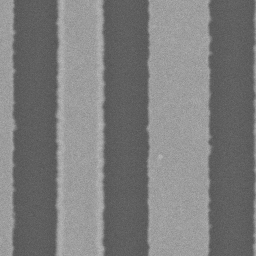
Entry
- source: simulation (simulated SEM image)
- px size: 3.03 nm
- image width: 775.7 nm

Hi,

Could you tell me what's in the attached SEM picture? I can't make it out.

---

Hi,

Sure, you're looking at lines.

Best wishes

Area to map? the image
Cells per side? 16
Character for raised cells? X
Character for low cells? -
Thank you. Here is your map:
X---XX---XXXX---
X---XX---XXXX---
X---XX---XXXX---
X---XX---XXXX---
X---XX---XXXX---
X---XX---XXXX---
X---XX---XXXX---
X---XX---XXXX---
X---XX---XXXX---
X---XX---XXXX---
X---XX---XXXX---
X---XX---XXXX---
X---XX---XXXX---
X---XX---XXXX---
X---XX---XXXX---
X---XX---XXXX---